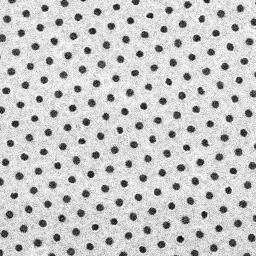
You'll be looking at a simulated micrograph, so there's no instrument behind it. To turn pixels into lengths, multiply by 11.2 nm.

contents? a regular array of holes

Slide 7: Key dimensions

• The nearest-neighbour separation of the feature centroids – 217 nm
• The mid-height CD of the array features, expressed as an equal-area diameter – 7.82 pixels